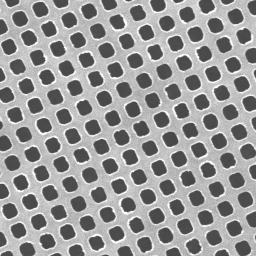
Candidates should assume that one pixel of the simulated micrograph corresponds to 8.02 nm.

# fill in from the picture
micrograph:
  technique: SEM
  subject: a regular array of holes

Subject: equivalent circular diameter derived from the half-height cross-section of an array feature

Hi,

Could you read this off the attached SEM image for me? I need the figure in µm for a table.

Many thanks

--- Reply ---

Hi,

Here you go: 0.124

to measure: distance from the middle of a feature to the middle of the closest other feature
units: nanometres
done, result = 171